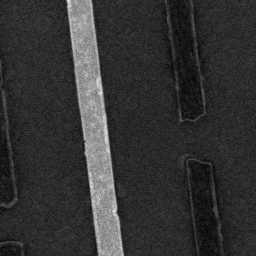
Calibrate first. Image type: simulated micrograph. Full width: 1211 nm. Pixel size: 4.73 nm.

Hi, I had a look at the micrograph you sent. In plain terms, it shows one or a few lines or trenches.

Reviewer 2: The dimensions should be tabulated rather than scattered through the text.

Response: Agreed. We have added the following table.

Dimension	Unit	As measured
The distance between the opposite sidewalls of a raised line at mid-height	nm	116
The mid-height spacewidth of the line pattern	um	0.35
